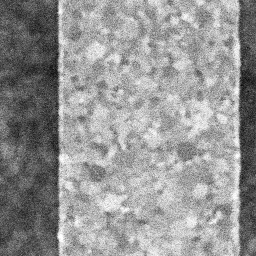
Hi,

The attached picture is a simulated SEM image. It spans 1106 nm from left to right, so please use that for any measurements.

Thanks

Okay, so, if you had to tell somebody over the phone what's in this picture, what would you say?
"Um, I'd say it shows one or a few lines or trenches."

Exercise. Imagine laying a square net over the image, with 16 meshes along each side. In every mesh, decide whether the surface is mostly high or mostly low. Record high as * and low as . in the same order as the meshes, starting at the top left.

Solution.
....***********.
....***********.
....***********.
....***********.
....***********.
....***********.
....***********.
....***********.
....***********.
....***********.
....***********.
....***********.
....***********.
....***********.
....***********.
....***********.